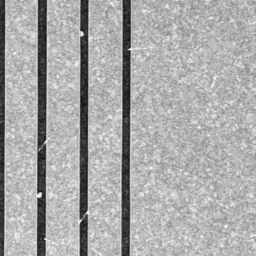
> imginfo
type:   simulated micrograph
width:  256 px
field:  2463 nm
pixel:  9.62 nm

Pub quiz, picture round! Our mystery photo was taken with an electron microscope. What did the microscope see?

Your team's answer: parallel lines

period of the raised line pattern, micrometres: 0.404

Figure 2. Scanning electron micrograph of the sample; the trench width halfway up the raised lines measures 83 nm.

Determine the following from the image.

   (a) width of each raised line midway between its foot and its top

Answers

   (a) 318 nm